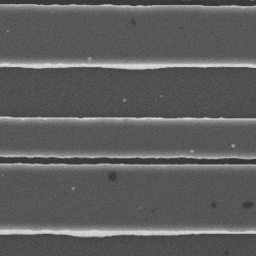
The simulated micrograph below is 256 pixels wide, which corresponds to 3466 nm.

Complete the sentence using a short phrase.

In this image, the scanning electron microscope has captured lines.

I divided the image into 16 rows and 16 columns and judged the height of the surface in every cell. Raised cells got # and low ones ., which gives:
################
################
################
################
................
................
................
################
################
################
################
################
################
################
################
................